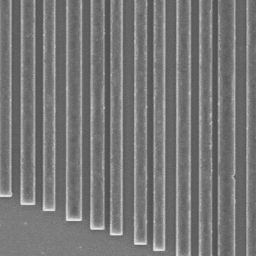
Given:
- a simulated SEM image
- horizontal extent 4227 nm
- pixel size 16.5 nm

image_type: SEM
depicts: parallel lines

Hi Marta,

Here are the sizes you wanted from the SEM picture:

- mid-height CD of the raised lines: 12.4 px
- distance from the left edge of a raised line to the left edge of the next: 22 px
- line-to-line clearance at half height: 159 nm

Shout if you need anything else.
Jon